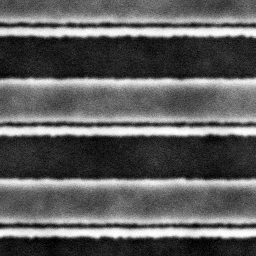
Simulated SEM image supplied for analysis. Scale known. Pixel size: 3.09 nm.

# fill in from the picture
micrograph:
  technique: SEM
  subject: lines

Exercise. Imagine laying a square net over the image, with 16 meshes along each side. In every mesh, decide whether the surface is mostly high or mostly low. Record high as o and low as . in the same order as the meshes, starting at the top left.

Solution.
oooooooooooooooo
oooooooooooooooo
................
................
................
oooooooooooooooo
oooooooooooooooo
oooooooooooooooo
................
................
................
oooooooooooooooo
oooooooooooooooo
oooooooooooooooo
oooooooooooooooo
................